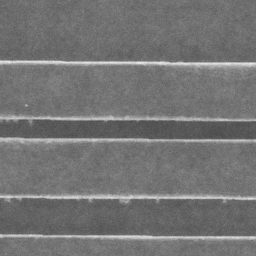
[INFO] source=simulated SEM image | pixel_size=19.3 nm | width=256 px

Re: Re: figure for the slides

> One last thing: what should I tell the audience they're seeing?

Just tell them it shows lines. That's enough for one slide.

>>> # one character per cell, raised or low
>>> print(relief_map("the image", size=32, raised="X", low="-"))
--------------------------------
--------------------------------
--------------------------------
--------------------------------
--------------------------------
--------------------------------
--------------------------------
--------------------------------
XXXXXXXXXXXXXXXXXXXXXXXXXXXXXXXX
XXXXXXXXXXXXXXXXXXXXXXXXXXXXXXXX
XXXXXXXXXXXXXXXXXXXXXXXXXXXXXXXX
XXXXXXXXXXXXXXXXXXXXXXXXXXXXXXXX
XXXXXXXXXXXXXXXXXXXXXXXXXXXXXXXX
XXXXXXXXXXXXXXXXXXXXXXXXXXXXXXXX
XXXXXXXXXXXXXXXXXXXXXXXXXXXXXXXX
--------------------------------
--------------------------------
XXXXXXXXXXXXXXXXXX--------------
XXXXXXXXXXXXXXXXXXXXXXXXXXXXXXXX
XXXXXXXXXXXXXXXXXXXXXXXXXXXXXXXX
XXXXXXXXXXXXXXXXXXXXXXXXXXXXXXXX
XXXXXXXXXXXXXXXXXXXXXXXXXXXXXXXX
XXXXXXXXXXXXXXXXXXXXXXXXXXXXXXXX
XXXXXXXXXXXXXXXXXXXXXXXXXXXXXXXX
XXXXXXXXXXXXXXXXXXXXXXXXXXXXXXXX
--------------------------------
--------------------------------
--------------------------------
--------------------------------
XXXXX---------------------------
XXXXXXXXXXXXXXXXXXXXXXXXXXXXXXXX
XXXXXXXXXXXXXXXXXXXXXXXXXXXXXXXX